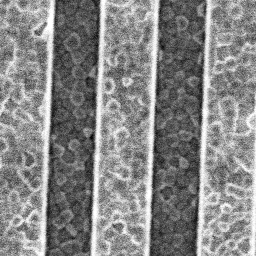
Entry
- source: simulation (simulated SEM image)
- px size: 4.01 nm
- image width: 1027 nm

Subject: one or a few lines or trenches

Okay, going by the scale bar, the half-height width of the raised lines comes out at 221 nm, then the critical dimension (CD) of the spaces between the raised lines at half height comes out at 200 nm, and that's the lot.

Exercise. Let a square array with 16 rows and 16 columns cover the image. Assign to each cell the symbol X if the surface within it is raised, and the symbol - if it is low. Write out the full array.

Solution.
XXX---XXXX---XXX
XXX---XXXX---XXX
XXX---XXXX---XXX
XXX---XXXX---XXX
XXX---XXXX---XXX
XXX---XXXX---XXX
XXX---XXXX---XXX
XXX---XXXX---XXX
XXX---XXXX---XXX
XXX---XXX----XXX
XXX---XXX----XXX
XXX---XXX----XXX
XXX---XXX----XXX
XXX---XXX----XXX
XXX---XXX---XXXX
XXX---XXX---XXXX